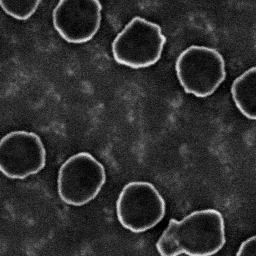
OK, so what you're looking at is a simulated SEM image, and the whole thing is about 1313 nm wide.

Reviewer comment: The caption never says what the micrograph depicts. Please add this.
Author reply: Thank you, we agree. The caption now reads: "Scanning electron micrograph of raised bodies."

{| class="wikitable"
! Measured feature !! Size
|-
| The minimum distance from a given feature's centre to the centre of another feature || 342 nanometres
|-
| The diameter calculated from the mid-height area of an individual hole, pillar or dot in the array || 247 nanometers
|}